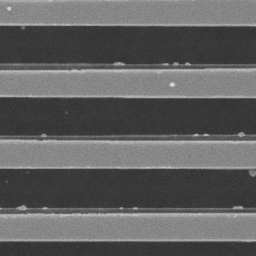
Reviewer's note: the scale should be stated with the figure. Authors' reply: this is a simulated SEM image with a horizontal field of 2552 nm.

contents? lines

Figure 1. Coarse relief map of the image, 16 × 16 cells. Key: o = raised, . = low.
oooooooooooooooo
oooooooooooooooo
................
................
oooooooooooooooo
oooooooooooooooo
................
................
..o.......oooooo
oooooooooooooooo
oooooooooooooooo
................
................
oooooooooooooooo
oooooooooooooooo
................